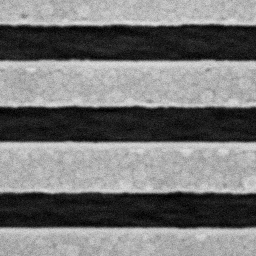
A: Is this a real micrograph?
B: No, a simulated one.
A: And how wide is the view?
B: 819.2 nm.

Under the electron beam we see lines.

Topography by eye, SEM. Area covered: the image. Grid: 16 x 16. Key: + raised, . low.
++++++++++++++++
+.+++++.++++...+
................
................
++++++++++++++++
++++++++++++++++
++++++++++++++++
................
................
++++++++++++++++
++++++++++++++++
++++++++++++++++
................
................
++++++++++++++++
++++++++++++++++